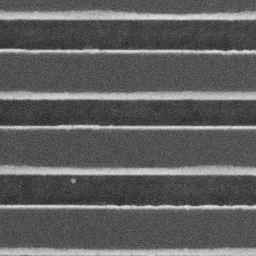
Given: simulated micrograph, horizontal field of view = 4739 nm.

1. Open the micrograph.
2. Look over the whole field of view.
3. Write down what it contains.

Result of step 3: lines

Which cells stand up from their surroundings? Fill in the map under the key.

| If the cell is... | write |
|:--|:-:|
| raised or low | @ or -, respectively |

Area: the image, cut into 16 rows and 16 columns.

@@@@@@@@@@@@@@@@
----------------
----------------
@@@@@@@@@@@@@@@@
@@@@@@@@@@@@@@@@
@@@@@@@@@@@@@@@@
----------------
----------------
@@@@@@@@@@@@@@@@
@@@@@@@@@@@@@@@@
@@@@@@@@@@@@@@@@
----------------
----------------
@@@@@@@@@@@@@@@@
@@@@@@@@@@@@@@@@
@@@@@@@@@@@@@@@@